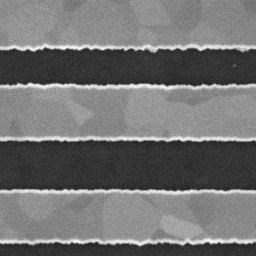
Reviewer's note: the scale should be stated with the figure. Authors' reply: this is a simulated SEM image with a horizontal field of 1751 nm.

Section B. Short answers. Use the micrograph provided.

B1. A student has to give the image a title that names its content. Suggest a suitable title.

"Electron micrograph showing lines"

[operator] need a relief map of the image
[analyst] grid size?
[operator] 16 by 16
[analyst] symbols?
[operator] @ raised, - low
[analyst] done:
@@@@@@@@@@@@@@@@
@@@@@@@@@@@@@@@@
@@@@@@@@@@@@@@@@
----------------
----------------
@@@@@@@@@@@@@@@@
@@@@@@@@@@@@@@@@
@@@@@@@@@@@@@@@@
@@@@@@@@@@@@@@@@
----------------
----------------
----------------
@@@@@@@@@@@@@@@@
@@@@@@@@@@@@@@@@
@@@@@@@@@@@@@@@@
----------------